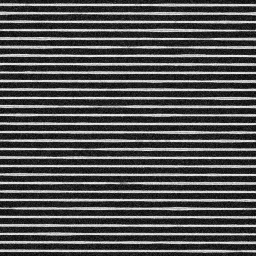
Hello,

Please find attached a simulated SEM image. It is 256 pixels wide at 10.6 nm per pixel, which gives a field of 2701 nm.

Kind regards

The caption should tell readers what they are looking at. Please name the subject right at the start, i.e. parallel lines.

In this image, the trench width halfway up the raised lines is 6.5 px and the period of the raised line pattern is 89.5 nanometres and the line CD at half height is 17.1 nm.